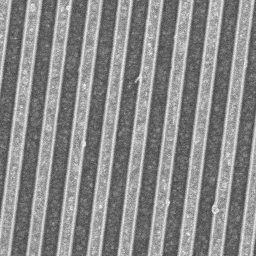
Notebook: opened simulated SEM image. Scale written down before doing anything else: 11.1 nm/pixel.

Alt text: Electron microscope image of parallel lines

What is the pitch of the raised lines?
335 nm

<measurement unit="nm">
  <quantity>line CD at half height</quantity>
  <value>138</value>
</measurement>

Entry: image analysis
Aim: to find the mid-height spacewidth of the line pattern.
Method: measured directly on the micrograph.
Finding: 17.1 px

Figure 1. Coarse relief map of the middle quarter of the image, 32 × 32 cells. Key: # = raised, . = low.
....###.....###....####....###..
....###.....###....###.....###..
....###.....###....###.....###..
....###....###.....###.....###..
....###....###.....###.....###..
....###....###.....###.....##...
...####....###.....###....###...
...###.....###.....###....###...
...###.....###....###.....###...
...###.....###....###.....###...
...###.....###....###.....###...
...###....####....###.....###...
...###....####....###.....###...
...###....###.....###.....##....
..####....###.....###....###....
...##.....###.....###....###....
..###.....###....####....###....
..###.....###....####....###....
..###.....###....###.....###....
..###....###.....###.....###....
..###....###.....###.....###....
..###....###.....###.....##.....
.####....###.....###....###.....
..##.....###.....###....###.....
.###.....###....###.....###.....
.###.....###....###.....###....#
.###.....###....###.....###....#
.###....####....###.....###....#
.###....####....###.....###....#
.###....###.....###....####....#
####....###.....###....###.....#
###.....###.....###....###.....#